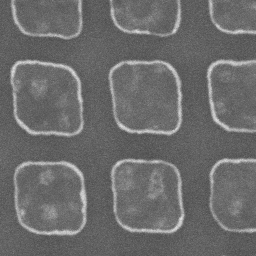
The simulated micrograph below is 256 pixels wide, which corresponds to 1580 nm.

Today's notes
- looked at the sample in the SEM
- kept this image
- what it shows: raised bodies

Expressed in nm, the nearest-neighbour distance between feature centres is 605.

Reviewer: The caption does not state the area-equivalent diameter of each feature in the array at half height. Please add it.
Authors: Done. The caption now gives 76.5 px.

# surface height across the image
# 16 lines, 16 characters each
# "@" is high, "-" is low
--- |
-@@@@--@@@@--@@@
-@@@@--@@@@--@@@
----------------
----------------
-@@@@--@@@@--@@@
-@@@@--@@@@--@@@
-@@@@--@@@@--@@@
-@@@@--@@@@---@@
----------------
----------------
-@@@@--@@@@--@@@
-@@@@--@@@@--@@@
-@@@@--@@@@--@@@
-@@@@--@@@@--@@@
--@@@----@@-----
----------------